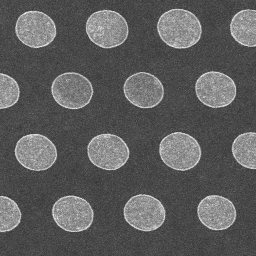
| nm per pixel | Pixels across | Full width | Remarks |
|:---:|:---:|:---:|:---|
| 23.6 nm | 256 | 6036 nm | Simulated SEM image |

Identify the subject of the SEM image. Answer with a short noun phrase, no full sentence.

a regular array of raised bodies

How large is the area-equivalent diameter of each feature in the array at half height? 885 nanometers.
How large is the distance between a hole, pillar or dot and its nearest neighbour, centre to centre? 1680 nanometres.